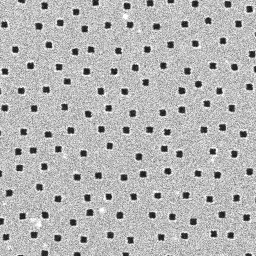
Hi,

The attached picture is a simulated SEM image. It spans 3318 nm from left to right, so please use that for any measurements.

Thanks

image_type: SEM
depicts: a regular array of holes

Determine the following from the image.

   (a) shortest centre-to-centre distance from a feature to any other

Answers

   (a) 266 nanometers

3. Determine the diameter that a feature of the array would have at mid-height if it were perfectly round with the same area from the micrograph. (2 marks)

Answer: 101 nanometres